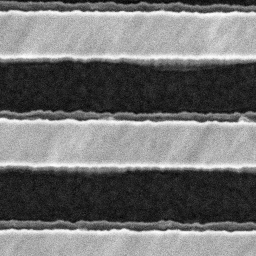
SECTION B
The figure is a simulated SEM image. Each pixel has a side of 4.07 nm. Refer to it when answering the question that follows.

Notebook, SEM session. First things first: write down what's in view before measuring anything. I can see lines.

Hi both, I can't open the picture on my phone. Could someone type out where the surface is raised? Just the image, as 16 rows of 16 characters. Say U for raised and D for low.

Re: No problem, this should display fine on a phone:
UUUUUUUUUUUUUUUU
UUUUUUUUUUUUUUUU
UUUUUUUUUUUUUUUU
UUUUUUUUUUUUUUUU
DDDDDDDDDDDDDDDD
DDDDDDDDDDDDDDDD
DDDDDDDDDDDDDDDD
UUUUUUUUUUUUUUUU
UUUUUUUUUUUUUUUU
UUUUUUUUUUUUUUUU
DDDDDDDDDDDDUUUD
DDDDDDDDDDDDDDDD
DDDDDDDDDDDDDDDD
DDDDDDDDDDDDDDDD
UUUUUUUUUUUUUUUU
UUUUUUUUUUUUUUUU